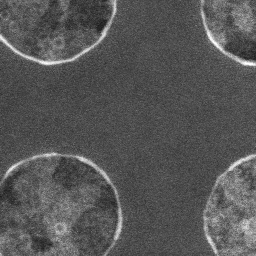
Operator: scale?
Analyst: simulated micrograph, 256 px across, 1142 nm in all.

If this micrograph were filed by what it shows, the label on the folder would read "raised bodies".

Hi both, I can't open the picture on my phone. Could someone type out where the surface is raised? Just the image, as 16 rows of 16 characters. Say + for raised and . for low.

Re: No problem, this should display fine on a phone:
+++++++......+++
+++++++......+++
++++++.......+++
..+++.........++
................
................
................
................
................
................
.+++++..........
+++++++.........
+++++++.........
++++++++........
+++++++.........
+++++++.........